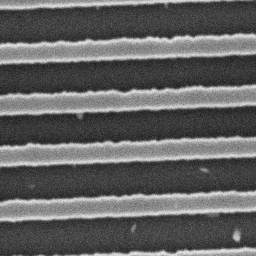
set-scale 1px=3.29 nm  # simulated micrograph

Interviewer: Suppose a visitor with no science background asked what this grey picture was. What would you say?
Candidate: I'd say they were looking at lines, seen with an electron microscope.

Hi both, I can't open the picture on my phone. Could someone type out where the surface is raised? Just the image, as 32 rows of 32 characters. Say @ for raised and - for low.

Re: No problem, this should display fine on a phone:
@@@@@@@@@@@@@@@@----------------
--------------------------------
--------------------------------
--------------------------------
--------------------------@-@@@@
-----@-@@@@@@@@@@@@@@@@@@@@@@@@@
@@@@@@@@@@@@@@@@@@@@@@@@@@@@@@@@
@@@@@@@@@@----------------------
--------------------------------
--------------------------------
--------------------------------
------------@@@-@@@@@@@@@@@@@@@@
@@@@@@@@@@@@@@@@@@@@@@@@@@@@@@@@
@@@@@@@@@@@@@@@@@@@@------------
--------------------------------
--------------------------------
--------------------------------
-----------------------@@@@@@@@@
@@@@@@@@@@@@@@@@@@@@@@@@@@@@@@@@
@@@@@@@@@@@@@@@@@@@@@@@@@@@@@@@@
@@@@@@@-------------------------
--------------------------------
--------------------------------
--------------------------------
----------------@@@@@@@@@@@@@@@@
@@@@@@@@@@@@@@@@@@@@@@@@@@@@@@@@
@@@@@@@@@@@@@@@@@@@@@@@@@@------
@@------------------------------
--------------------------------
--------------------------------
--------------------------------
----------------------@@@@@@@@@@